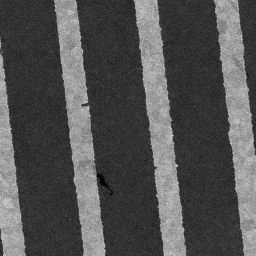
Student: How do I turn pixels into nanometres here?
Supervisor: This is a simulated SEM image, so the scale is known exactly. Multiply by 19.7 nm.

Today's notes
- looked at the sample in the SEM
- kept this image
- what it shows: one or a few lines or trenches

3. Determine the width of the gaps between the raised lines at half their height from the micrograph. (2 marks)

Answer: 1150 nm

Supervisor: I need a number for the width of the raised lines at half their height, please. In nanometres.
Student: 423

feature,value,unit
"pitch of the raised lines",1.58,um